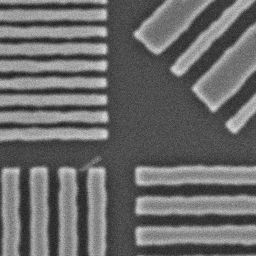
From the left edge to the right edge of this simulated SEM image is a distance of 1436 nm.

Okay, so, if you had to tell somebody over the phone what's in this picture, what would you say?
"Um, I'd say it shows groups of lines, slits or small figures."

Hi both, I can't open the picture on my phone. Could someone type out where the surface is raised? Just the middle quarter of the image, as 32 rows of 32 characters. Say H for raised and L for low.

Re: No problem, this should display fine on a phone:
HHHHHHHHHHLLLLLLLLLLLLLLLLLHHHHL
HHHHLLLLLLLLLLLLLLLLLLLLLLLHHHHL
LLLLLLLLLLLLLLLLLLLLLLLLLLLLHLLL
LLHHHLLLLLLLLLLLLLLLLLLLLLLLLLLL
HHHHHHHHHHLLLLLLLLLLLLLLLLLLLLLL
HHHHHHHHHHLLLLLLLLLLLLLLLLLLLLLL
LLLLLLLLLLLLLLLLLLLLLLLLLLLLLLLL
LLLLLLLLLLLLLLLLLLLLLLLLLLLLLLLL
HHHHHHHHHHLLLLLLLLLLLLLLLLLLLLLL
HHHHHHHHHHLLLLLLLLLLLLLLLLLLLLLL
LLLLLLLLLLLLLLLLLLLLLLLLLLLLLLLL
LLLLLLLLLLLLLLLLLLLLLLLLLLLLLLLL
HHHHHHHHHHHLLLLLLLLLLLLLLLLLLLLL
HHHHHHHHHHHLLLLLLLLLLLLLLLLLLLLL
LLLLLLLLLLLLLLLLLLLLLLLLLLLLLLLL
LLLLLLLLLLLLLLLLLLLLLLLLLLLLLLLL
HHHHHLHHHHLLLLLLLLLLLLLLLLLLLLLL
HHHHHHHHHHHLLLLLLLLLLLLLLLLLLLLL
HHHHHHHHHHLLLLLLLLLLLLLLLLLLLLLL
LLLLLLLLLLLLLLLLLLLLLLLLLLLLLLLL
LLLLLLLLLLLLLLLLLLLLLLLLLLLLLLLL
LLLLLLLLLLLLLLLLLLLLLLLLLLLLLLLL
LLLLLLLLLLLLLLLLLLLLLLLLLLLLLLLL
LLLLLLLLLLLLLLLLLLLLLLLLLLLLLLLL
LLLLLLLLLLLLLLLLLLLLLLLLLLLLLLLL
LLLLLLLLLLLLLLLLLLLLLLLLLLLLLLLL
HHLLLLHHHHLLLLLLLLHHHHHHHHHHHHHH
HHHLLLHHHHLLLLLLLLHHHHHHHHHHHHHH
HHHLLLHHHHLLLLLLLLHHHHHHHHHHHHHH
HHHLLLHHHHLLLLLLLLHHHHHHHHHHHHHH
HHHLLLHHHHLLLLLLLLLLLLLLLLLLLLLL
HHHLLLHHHHLLLLLLLLLLLLLLLLLLLLLL